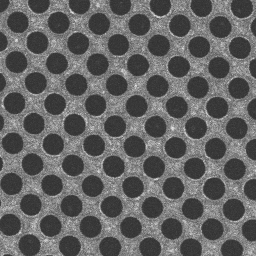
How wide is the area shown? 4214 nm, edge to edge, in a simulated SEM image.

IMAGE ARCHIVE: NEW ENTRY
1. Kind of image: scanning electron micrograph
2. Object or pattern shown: a regular array of holes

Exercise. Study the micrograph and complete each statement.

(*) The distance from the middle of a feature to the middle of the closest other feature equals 466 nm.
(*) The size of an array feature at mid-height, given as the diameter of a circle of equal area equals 368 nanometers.